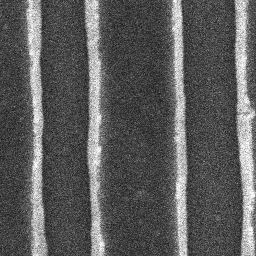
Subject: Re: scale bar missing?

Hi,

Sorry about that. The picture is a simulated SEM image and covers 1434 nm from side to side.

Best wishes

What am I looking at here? one or a few lines or trenches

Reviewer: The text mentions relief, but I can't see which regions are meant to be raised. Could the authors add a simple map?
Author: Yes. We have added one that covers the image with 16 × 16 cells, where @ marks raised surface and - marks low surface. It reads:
@@----@@@@@----@
@@----@@@@@----@
@@----@@@@@----@
@@----@@@@@----@
@@----@@@@@----@
@@----@@@@@----@
@@----@@@@@----@
@@----@@@@@----@
@@----@@@@@----@
@@----@@@@@----@
@@----@@@@@----@
@@----@@@@@----@
@@----@@@@@----@
@@----@@@@@----@
@@----@@@@@----@
@@----@@@@@----@